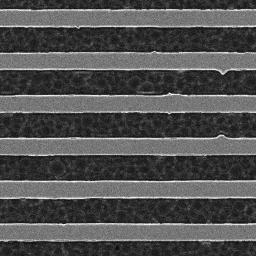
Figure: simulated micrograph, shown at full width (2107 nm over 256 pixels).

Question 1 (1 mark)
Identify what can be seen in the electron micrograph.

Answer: parallel lines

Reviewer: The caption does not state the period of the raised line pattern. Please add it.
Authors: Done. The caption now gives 352 nm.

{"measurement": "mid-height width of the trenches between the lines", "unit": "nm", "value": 214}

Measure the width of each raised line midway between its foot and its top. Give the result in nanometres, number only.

138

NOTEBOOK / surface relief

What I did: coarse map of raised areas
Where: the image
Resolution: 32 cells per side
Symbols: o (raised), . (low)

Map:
................................
oooooooooooooooooooooooooooooooo
oooooooooooooooooooooooooooooooo
................................
................................
................................
................................
oooooooooooooooooooooooooooooooo
oooooooooooooooooooooooooooooooo
..........o.....................
................................
..................o.............
oooooooooooooooooooooooooooooooo
oooooooooooooooooooooooooooooooo
................................
................................
................................
oooooooooooooooooooooooooooooooo
oooooooooooooooooooooooooooooooo
................................
................................
................................
................................
oooooooooooooooooooooooooooooooo
oooooooooooooooooooooooooooooooo
................................
................................
................................
oooooooooooooooooooooooooooooooo
oooooooooooooooooooooooooooooooo
................................
................................